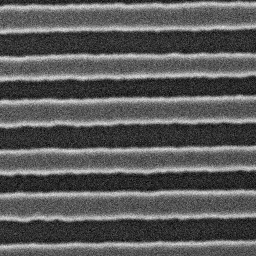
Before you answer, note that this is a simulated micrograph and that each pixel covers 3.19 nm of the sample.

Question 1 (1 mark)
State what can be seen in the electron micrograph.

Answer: lines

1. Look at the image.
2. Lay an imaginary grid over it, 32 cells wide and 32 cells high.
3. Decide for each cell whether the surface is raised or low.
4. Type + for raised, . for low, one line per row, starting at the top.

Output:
.........................+++.+++
++++++++++++++++++++++++++++++++
++++++++++++++++++++++++++++++++
+++++++++++++++++++++++++++++++.
................................
................................
................................
++++++++++++++++++++++++++++++++
++++++++++++++++++++++++++++++++
+++++++++++++++++++++++...+.....
................................
................................
.............+++++++++++++++++++
++++++++++++++++++++++++++++++++
++++++++++++++++++++++++++++++++
+++++++.++++++..................
................................
................................
...........................+++++
++++++++++++++++++++++++++++++++
++++++++++++++++++++++++++++++++
+++++++++++.......+.............
................................
................................
++++++++++++++++++++++++++++++++
++++++++++++++++++++++++++++++++
++++++++++++++++++++++++++++++++
..++............................
................................
................................
.........+...+++++++++++++++++++
++++++++++++++++++++++++++++++++